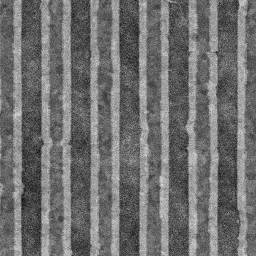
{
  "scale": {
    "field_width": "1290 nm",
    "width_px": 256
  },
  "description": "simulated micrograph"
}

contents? parallel lines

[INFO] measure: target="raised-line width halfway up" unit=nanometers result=114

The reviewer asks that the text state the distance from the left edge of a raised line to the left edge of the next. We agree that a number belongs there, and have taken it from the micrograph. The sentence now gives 49.1 pixels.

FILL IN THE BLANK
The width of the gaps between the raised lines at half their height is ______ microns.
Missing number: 0.136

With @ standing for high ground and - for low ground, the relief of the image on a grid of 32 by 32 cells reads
@@----@@----@@----@@@---@@@---@@
@@----@@----@@----@@@---@@@---@@
@@----@@----@@----@@@---@@@---@@
@@----@@----@@----@@@---@@@---@@
@@----@@----@@----@@@---@@@---@@
@@----@@----@@----@@@---@@@---@@
@@----@@----@@----@@@---@@@---@@
@@----@@----@@----@@@---@@@---@@
@@----@@----@@----@@@---@@@---@@
@@----@@----@@----@@@---@@@---@@
@@----@@----@@----@@@---@@@---@@
@@----@@----@@----@@@---@@@---@@
@@----@@----@@----@@@---@@@---@@
@@----@@----@@----@@@---@@@---@@
@@----@@----@@----@@@---@@@---@@
@@----@@----@@----@@@---@@@---@@
@@----@@----@@----@@@---@@@---@@
@@----@@----@@----@@@---@@@---@@
@@----@@----@@----@@@---@@@---@@
@@----@@----@@----@@@---@@@---@@
@@----@@----@@----@@@---@@@---@@
@@----@@----@@----@@@---@@@---@@
@@----@@----@@----@@@---@@@---@@
@@----@@----@@----@@@---@@@---@@
@@----@@----@@----@@@---@@@---@@
@@----@@----@@----@@@---@@@---@@
@@----@@----@@----@@@---@@@---@@
@@----@@----@@----@@@---@@@---@@
@@----@@----@@----@@@---@@@---@@
@@----@@----@@----@@@---@@@---@@
@@----@@----@@----@@@---@@@---@@
@@----@@----@@----@@@---@@@---@@